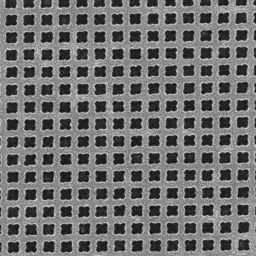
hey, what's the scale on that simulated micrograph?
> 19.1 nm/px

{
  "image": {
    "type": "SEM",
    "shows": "a regular array of holes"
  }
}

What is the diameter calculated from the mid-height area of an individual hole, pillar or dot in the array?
240 nanometres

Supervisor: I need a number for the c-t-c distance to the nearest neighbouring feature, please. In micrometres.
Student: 0.329